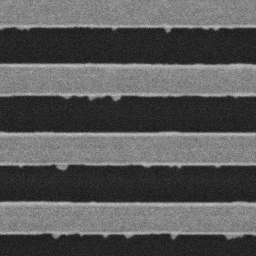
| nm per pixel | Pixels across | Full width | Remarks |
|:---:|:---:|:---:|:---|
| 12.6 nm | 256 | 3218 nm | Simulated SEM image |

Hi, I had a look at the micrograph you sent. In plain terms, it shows lines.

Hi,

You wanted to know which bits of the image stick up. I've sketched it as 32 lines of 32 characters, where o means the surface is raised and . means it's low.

oooooooooooooooooooooooooooooooo
oooooooooooooooooooooooooooooooo
oooooooooooooooooooooooooooooooo
................................
................................
................................
................................
................................
oooooooooooooooooooooooooooooooo
oooooooooooooooooooooooooooooooo
oooooooooooooooooooooooooooooooo
oooooooooooooooooooooooooooooooo
................................
................................
................................
................................
................................
oooooooooooooooooooooooooooooooo
oooooooooooooooooooooooooooooooo
oooooooooooooooooooooooooooooooo
ooooooo...oooooo.ooooooooooooooo
................................
................................
................................
................................
oooooooooooooooooooooooooooooooo
oooooooooooooooooooooooooooooooo
oooooooooooooooooooooooooooooooo
oooooooooooooooooooooooooooooooo
................................
................................
................................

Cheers